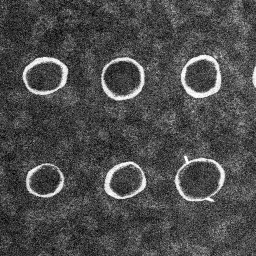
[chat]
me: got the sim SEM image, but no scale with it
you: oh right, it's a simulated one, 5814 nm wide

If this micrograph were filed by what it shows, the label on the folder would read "raised bodies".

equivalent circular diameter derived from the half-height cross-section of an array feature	862	nanometers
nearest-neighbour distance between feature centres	1770	nanometers